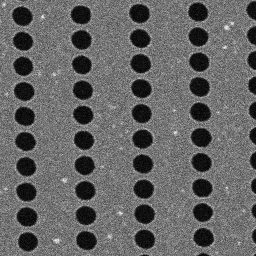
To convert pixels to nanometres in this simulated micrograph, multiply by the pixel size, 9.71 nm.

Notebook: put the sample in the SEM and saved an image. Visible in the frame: a regular array of holes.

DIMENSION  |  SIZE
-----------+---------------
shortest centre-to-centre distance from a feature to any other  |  242 nanometres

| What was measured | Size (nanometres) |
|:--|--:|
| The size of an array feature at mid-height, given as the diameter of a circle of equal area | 196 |